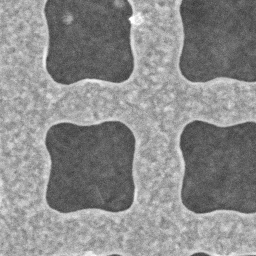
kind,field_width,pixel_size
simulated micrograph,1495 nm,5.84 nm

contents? holes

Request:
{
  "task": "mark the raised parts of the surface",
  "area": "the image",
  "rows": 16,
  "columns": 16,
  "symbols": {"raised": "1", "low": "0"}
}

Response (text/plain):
1110000011100000
1110000011100000
1110000011100000
1110000011100000
1110000011100000
1111111111111111
1111111111111111
1111111111111111
1110000011100000
1110000011100000
1110000011110000
1110000011100000
1110000011100000
1111111111111111
1111111111111111
1111111111111111